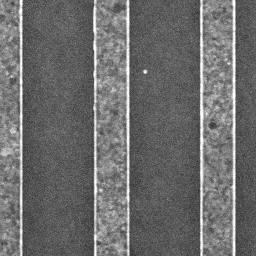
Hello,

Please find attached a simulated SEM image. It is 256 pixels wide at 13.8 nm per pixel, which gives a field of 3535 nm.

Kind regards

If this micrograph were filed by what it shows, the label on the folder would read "lines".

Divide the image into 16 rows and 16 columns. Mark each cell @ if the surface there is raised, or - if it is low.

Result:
@-----@@-----@@-
@-----@@-----@@-
@-----@@-----@@-
@-----@@-----@@-
@-----@@-----@@-
@-----@@-----@@-
@-----@@-----@@-
@-----@@-----@@-
@-----@@-----@@-
@-----@@-----@@-
@-----@@-----@@-
@-----@@-----@@-
@-----@@-----@@-
@-----@@-----@@-
@-----@@-----@@-
@-----@@-----@@-